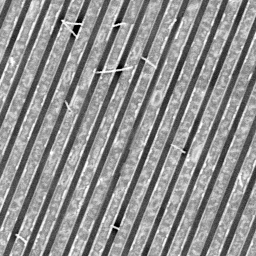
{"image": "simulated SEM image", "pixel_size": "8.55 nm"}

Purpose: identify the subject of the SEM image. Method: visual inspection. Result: parallel lines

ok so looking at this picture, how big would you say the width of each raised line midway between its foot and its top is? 103 nm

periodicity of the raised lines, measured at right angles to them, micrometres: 0.157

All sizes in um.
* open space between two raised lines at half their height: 0.0526